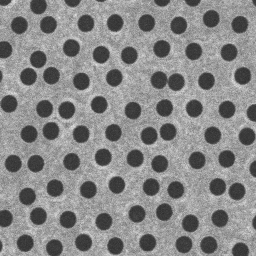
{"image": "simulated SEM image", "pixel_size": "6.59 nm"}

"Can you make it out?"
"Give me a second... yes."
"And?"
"a regular array of holes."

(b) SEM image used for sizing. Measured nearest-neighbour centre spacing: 180 nm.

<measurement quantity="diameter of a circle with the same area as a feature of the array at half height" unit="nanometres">111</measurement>